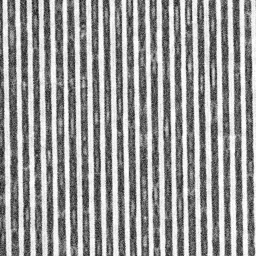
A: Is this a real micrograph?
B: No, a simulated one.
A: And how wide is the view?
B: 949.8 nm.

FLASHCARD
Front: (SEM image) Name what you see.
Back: parallel lines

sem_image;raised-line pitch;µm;0.0439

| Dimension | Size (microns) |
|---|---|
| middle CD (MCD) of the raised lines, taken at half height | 0.0107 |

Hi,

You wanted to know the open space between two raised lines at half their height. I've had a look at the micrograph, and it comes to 8.76 px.